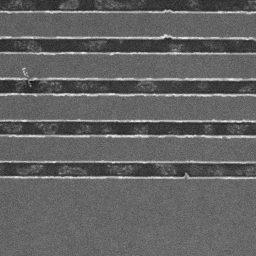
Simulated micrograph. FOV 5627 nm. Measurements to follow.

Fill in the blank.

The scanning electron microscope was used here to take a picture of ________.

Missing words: parallel lines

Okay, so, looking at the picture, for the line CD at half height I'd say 591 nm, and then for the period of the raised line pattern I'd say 0.907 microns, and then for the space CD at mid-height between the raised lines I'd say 0.316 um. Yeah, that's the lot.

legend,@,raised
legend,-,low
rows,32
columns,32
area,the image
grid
--------------------------------
@--@-@@@-@@@@-----@@@@@@---@@@@@
@@@@@@@@@@@@@@@@@@@@@@@@@@@@@@@@
@@@@@@@@@@@@@@@@@@@@@@@@@@@@@@@@
@@@@@@@@@@@@@@@@@@@@@@@@@@@@@@@@
--------------------------------
--------------------------------
@@@@@@@@@@@@@@@@@@@@@@@@@@@@@@@@
@@@@@@@@@@@@@@@@@@@@@@@@@@@@@@@@
@@@@@@@@@@@@@@@@@@@@@@@@@@@@@@@@
--------------------------------
--------------------------------
@@@@@@@@@@@@@@@@@@@@@@@@@@@@@@@@
@@@@@@@@@@@@@@@@@@@@@@@@@@@@@@@@
@@@@@@@@@@@@@@@@@@@@@@@@@@@@@@@@
--------------------------------
--------------------------------
@@@@@@@@@@@@@@@@@@@@@@@@@@@@@@@@
@@@@@@@@@@@@@@@@@@@@@@@@@@@@@@@@
@@@@@@@@@@@@@@@@@@@@@@@@@@@@@@@@
--------------------------------
--------------------------------
@@@@@@@@@@@@@@@@@@@@@@@@@@@@@@@@
@@@@@@@@@@@@@@@@@@@@@@@@@@@@@@@@
@@@@@@@@@@@@@@@@@@@@@@@@@@@@@@@@
@@@@@@@@@@@@@@@@@@@@@@@@@@@@@@@@
@@@@@@@@@@@@@@@@@@@@@@@@@@@@@@@@
@@@@@@@@@@@@@@@@@@@@@@@@@@@@@@@@
@@@@@@@@@@@@@@@@@@@@@@@@@@@@@@@@
@@@@@@@@@@@@@@@@@@@@@@@@@@@@@@@@
@@@@@@@@@@@@@@@@@@@@@@@@@@@@@@@@
@@@@@@@@@@@@@@@@@@@@@@@@@@@@@@@@